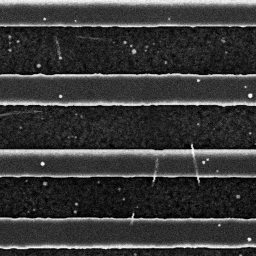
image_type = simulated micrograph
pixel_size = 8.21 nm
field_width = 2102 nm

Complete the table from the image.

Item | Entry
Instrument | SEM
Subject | lines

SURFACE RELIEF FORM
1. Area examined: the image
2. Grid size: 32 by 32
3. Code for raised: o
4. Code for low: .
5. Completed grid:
oooooooooooooooooooooooooooooooo
oooooooooooooooooooooooooooooooo
oooooooooooooooooooooooooooooooo
................................
................................
................................
................................
................................
................................
oooooooooooooooooooooooooooooooo
oooooooooooooooooooooooooooooooo
oooooooooooooooooooooooooooooooo
oooooooooooooooooooooooooooooooo
................................
................................
................................
................................
................................
................................
oooooooooooooooooooooooooooooooo
oooooooooooooooooooooooooooooooo
oooooooooooooooooooooooooooooooo
................................
................................
................................
................................
................................
oooooooooooooooooooooooooooooooo
oooooooooooooooooooooooooooooooo
oooooooooooooooooooooooooooooooo
oooooooooooooooooooooooooooooooo
................................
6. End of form